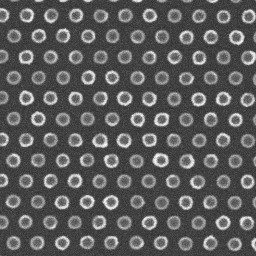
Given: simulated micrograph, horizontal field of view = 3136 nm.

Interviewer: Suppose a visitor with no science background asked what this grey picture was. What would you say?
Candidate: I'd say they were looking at a regular array of raised bodies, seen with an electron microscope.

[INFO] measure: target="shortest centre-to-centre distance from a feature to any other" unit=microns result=0.287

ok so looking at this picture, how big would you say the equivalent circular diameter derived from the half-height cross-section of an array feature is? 161 nanometers